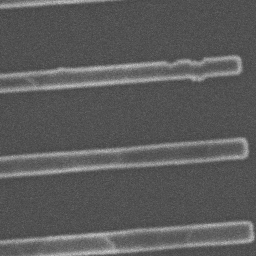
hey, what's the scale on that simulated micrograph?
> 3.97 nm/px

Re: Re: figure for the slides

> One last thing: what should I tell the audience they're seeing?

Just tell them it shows one or a few lines or trenches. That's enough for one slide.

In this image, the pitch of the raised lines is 331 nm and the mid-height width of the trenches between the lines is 265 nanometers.